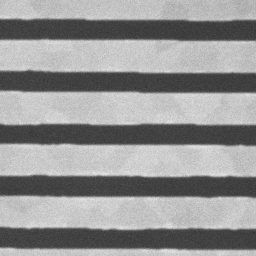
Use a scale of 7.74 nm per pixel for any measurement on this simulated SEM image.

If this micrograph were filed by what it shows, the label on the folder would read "lines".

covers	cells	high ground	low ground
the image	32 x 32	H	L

HHHHHHHHHHHHHHHHHHHHHHHHHHHHHHHH
HHHHHHHHHHHHHHHHHHHHHHHHHHHHHHHH
LLLLLLLLLLLLLLLLLLLLLLLHHHHHHLLL
LLLLLLLLLLLLLLLLLLLLLLLLLLLLLLLL
LLLLLLLLLLLLLLLLLLLLLLLLLLLLLLLL
HHHHHHHHHHHHHHHHHHHHHHHHHHHHHHHH
HHHHHHHHHHHHHHHHHHHHHHHHHHHHHHHH
HHHHHHHHHHHHHHHHHHHHHHHHHHHHHHHH
HHHHHHHHHHHHHHHHHHHHHHHHHHHHHHHH
LLLLLLLLLLLLLLLLLLLLLLLLLLLLLLLL
LLLLLLLLLLLLLLLLLLLLLLLLLLLLLLLL
HHHLLLLLLLLLLLLLLLLLLLLLLLLLLLLL
HHHHHHHHHHHHHHHHHHHHHHHHHHHHHHHH
HHHHHHHHHHHHHHHHHHHHHHHHHHHHHHHH
HHHHHHHHHHHHHHHHHHHHHHHHHHHHHHHH
HHHHHLLLLLLHHHHHHHLLLLLLHHHHHHHH
LLLLLLLLLLLLLLLLLLLLLLLLLLLLLLLL
LLLLLLLLLLLLLLLLLLLLLLLLLLLLLLLL
HHHHHHHHHHHHHHHHHHHHHHHHHHHHHHHH
HHHHHHHHHHHHHHHHHHHHHHHHHHHHHHHH
HHHHHHHHHHHHHHHHHHHHHHHHHHHHHHHH
HHHHHHHHHHHHHHHHHHHHHHHHHHHHHHHH
LLLLLLLLLLLLLLLLLLLLLLLLLLLLLLLL
LLLLLLLLLLLLLLLLLLLLLLLLLLLLLLLL
LLLLLLLLLLLLLLLLLLLLLLLLLLLLLLLL
HHHHHHHHHHHHHHHHHHHHHHHHHHHHHHHH
HHHHHHHHHHHHHHHHHHHHHHHHHHHHHHHH
HHHHHHHHHHHHHHHHHHHHHHHHHHHHHHHH
LLLHLHLLLLLHHHHHHHHHHHHHHHHHHHHH
LLLLLLLLLLLLLLLLLLLLLLLLLLLLLLLL
LLLLLLLLLLLLLLLLLLLLLLLLLLLLLLLL
HHHHHHHHHHHHHHHHHHHHHHHHHHHHHHHH